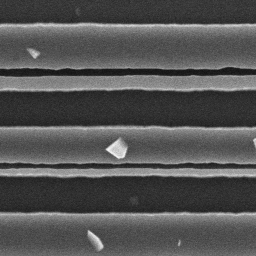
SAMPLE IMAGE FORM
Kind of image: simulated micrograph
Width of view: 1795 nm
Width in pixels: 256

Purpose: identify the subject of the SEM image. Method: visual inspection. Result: lines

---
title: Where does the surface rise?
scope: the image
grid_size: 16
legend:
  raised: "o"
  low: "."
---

................
................
oooooooooooooooo
oooooooooooooooo
oooooooooooooooo
oooooooooooooooo
................
................
oooooooooooooooo
oooooooooooooooo
oooooooooooooooo
................
................
oooooooooooooooo
oooooooooooooooo
oooooooooooooooo